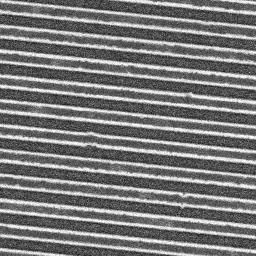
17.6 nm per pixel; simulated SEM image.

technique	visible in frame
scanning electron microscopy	parallel lines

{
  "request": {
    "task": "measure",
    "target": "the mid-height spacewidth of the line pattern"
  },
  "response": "249 nanometres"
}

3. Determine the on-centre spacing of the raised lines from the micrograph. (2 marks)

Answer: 434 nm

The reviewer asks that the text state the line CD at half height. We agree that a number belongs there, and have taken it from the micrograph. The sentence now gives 0.183 micrometres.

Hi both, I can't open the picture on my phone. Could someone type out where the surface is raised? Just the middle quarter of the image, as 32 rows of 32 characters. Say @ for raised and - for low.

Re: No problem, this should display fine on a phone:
@@@@@@@@@@@@@@@@@@@@------------
------@@@@@@@@@@@@@@@@@@@@@@@---
----------------@@@@@@@@@@@@@@@@
-------------------------@@@@@@@
--------------------------------
@@@@@@@@@-----------------------
@@@@@@@@@@@@@@@@@@--------------
---@@@@@@@@@@@@@@@@@@@@@@@@@---@
--------------@@@@@@@@@@@@@@@@@@
----------------------@@@@@@@@@@
--------------------------------
@@@@@@@-------------------------
@@@@@@@@@@@@@@@@----------------
@@@@@@@@@@@@@@@@@@@@@@@@--------
----------@@@@@@@@@@@@@@@@@@@@@@
--------------------@@@@@@@@@@@@
-----------------------------@@@
@@@---@-------------------------
@@@@@@@@@@@@@-------------------
@@@@@@@@@@@@@@@@@@@@@@----------
---------@@@@@@@@@@@@@@@@@@@@@@@
------------------@@@@@@@@@@@@@@
---------------------------@@@@@
@-------------------------------
@@@@@@@@@@@---------------------
@@@@@@@@@@@@@@@@@@@@------------
-------@@@@@@@@@@@@@@@@@@@@@@@--
----------------@@@@@@@@@@@@@@@@
--------------------------@@@@@@
--------------------------------
@@@@@@@@@-----------------------
@@@@@@@@@@@@@@@@@@@-------------